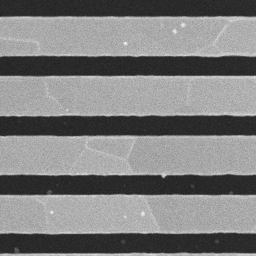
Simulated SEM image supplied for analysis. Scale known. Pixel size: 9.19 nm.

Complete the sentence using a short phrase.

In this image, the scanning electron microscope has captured lines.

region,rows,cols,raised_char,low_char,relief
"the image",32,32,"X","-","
--------------------------------
--------------------------------
XXXXXXXXXXXXXXXXXXXXXXXXXXXXXXXX
XXXXXXXXXXXXXXXXXXXXXXXXXXXXXXXX
XXXXXXXXXXXXXXXXXXXXXXXXXXXXXXXX
XXXXXXXXXXXXXXXXXXXXXXXXXXXXXXXX
XXXXXXXXXXXXXXXXXXXXXXXXXXXXXXXX
--------------------------------
--------------------------------
--------------------------------
XXXXXXXXXXXXXXXXXXXXXXXXXXXXXXXX
XXXXXXXXXXXXXXXXXXXXXXXXXXXXXXXX
XXXXXXXXXXXXXXXXXXXXXXXXXXXXXXXX
XXXXXXXXXXXXXXXXXXXXXXXXXXXXXXXX
XXXXXXXX---X-X-X-X--X---------X-
--------------------------------
--------------------------------
XXXXXXXXXXXXXXXXXXXXXXXXXXXXXXXX
XXXXXXXXXXXXXXXXXXXXXXXXXXXXXXXX
XXXXXXXXXXXXXXXXXXXXXXXXXXXXXXXX
XXXXXXXXXXXXXXXXXXXXXXXXXXXXXXXX
XXXXXXXXXXXXXXXXXXXXXXXXXXXXXXXX
--------------------------------
--------------------------------
XXXXXXXXXXXXXXXXXXXXXXXXXXXXXXXX
XXXXXXXXXXXXXXXXXXXXXXXXXXXXXXXX
XXXXXXXXXXXXXXXXXXXXXXXXXXXXXXXX
XXXXXXXXXXXXXXXXXXXXXXXXXXXXXXXX
XXXXXXXXXXXXXXXXXXXXXXXXXXXXXXXX
--------------------------------
--------------------------------
--------------------------------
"